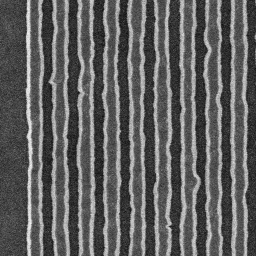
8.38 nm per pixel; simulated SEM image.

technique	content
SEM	parallel lines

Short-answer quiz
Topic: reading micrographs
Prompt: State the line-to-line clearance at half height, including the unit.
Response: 13.2 pixels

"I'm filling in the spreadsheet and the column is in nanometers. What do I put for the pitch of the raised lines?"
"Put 214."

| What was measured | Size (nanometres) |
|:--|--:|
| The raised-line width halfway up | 104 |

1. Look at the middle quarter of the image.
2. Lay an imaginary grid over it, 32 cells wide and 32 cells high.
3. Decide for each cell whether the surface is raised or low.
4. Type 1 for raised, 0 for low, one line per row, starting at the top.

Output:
00000110001110001111000111000111
00000110001110000110000111000011
10001110001110000111000111000011
10001110001110001111000111000011
00001110001110001111000111000011
00001110001110000111000111000011
00001110001110000111000111000011
00001110001110000111000111000011
00001110001110000110000111000011
00001110001110000110000111000011
10001110001110000111000111000011
10001110001110000111000111000011
10001110000110000111000111000011
10001110000110000111000111000011
10001110000111000110000111000011
10001110001111000110000111000011
00001110001111000110000111000011
00001110001110000111000111000011
00001110000110000111000111000011
00001110001111000111000111000011
10001110001111000111000111000011
00001110001111000111000111000011
00001110001111000111000111000011
00001110000111000110000111000011
00001110000111000111000111000011
00001110001110000111000111000011
10001110001110000111000111000011
10001110001111000111000111000011
10001110001111000111000111000011
10001110001111000111000111000011
00001110001111000111000111000011
10001110001110000111000111100011